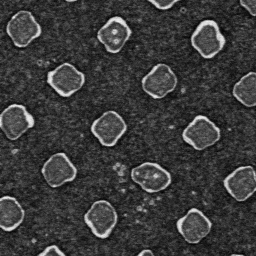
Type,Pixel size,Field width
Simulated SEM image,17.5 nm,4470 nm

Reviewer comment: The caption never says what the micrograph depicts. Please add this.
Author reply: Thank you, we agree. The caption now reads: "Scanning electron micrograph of a regular array of raised bodies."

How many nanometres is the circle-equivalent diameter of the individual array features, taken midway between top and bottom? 549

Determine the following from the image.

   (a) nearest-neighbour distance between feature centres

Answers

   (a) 1120 nm